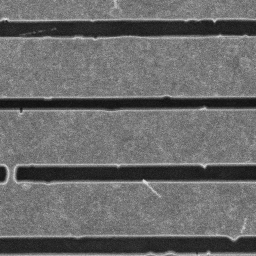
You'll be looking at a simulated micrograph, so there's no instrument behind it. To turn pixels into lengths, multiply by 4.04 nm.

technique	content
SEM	one or a few lines or trenches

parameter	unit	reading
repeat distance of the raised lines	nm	287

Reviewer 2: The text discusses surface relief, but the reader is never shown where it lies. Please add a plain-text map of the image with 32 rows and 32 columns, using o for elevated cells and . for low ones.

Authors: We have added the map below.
oooooooooooooooooooooooooooooooo
oooooooooooooooooooooooooooooooo
oooooooooo.oo.......ooooooo.....
................................
...........................o..o.
oooooooooooooooooooooooooooooooo
oooooooooooooooooooooooooooooooo
oooooooooooooooooooooooooooooooo
oooooooooooooooooooooooooooooooo
oooooooooooooooooooooooooooooooo
oooooooooooooooooooooooooooooooo
oooooooooooooooooooooooooooooooo
................................
................................
oooooooooooooooooooooooooooooooo
oooooooooooooooooooooooooooooooo
oooooooooooooooooooooooooooooooo
oooooooooooooooooooooooooooooooo
oooooooooooooooooooooooooooooooo
oooooooooooooooooooooooooooooooo
oooooooooooooooooooooooooooooooo
.o..............................
.o..............................
oooooooooooooooooooooooooooooooo
oooooooooooooooooooooooooooooooo
oooooooooooooooooooooooooooooooo
oooooooooooooooooooooooooooooooo
oooooooooooooooooooooooooooooooo
oooooooooooooooooooooooooooooooo
ooooooooooo................ooooo
................................
................................